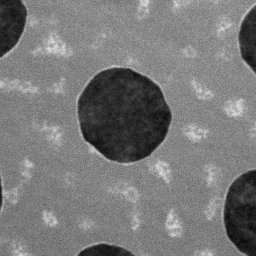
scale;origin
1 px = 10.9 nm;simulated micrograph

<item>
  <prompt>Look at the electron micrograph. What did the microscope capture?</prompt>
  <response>holes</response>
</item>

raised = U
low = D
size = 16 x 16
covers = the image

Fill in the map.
DDUUUUUUUUUUUUUU
DDUUUUUUUUUUUUUD
DUUUUUUUUUUUUUUD
UUUUUUUUUUUUUUUD
UUUUUUDDDUUUUUUU
UUUUUDDDDDUUUUUU
UUUUUDDDDDUUUUUU
UUUUUDDDDDDUUUUU
UUUUUDDDDDUUUUUU
UUUUUUDDDDUUUUUU
UUUUUUUUUUUUUUUU
UUUUUUUUUUUUUUDD
UUUUUUUUUUUUUUDD
UUUUUUUUUUUUUUDD
UUUUUUUUUUUUUUDD
UUUUUDDDUUUUUUUD